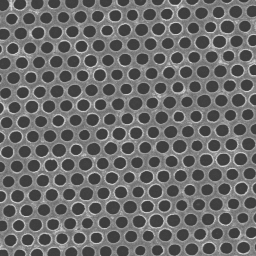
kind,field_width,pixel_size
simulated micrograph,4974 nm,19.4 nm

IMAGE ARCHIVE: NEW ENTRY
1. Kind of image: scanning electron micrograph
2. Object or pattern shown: a regular array of holes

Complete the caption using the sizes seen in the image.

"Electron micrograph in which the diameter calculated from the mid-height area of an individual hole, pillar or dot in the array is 231 nanometres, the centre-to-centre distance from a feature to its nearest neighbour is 327 nm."